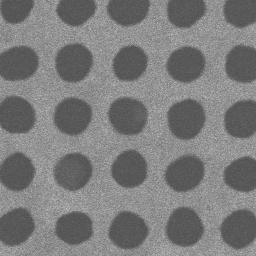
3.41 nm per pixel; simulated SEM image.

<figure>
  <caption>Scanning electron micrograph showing a regular array of holes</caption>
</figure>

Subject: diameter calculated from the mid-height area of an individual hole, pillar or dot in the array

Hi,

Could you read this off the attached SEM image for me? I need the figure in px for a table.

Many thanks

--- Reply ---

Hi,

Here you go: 37.5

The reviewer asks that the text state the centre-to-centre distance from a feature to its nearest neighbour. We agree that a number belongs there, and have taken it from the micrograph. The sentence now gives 183 nanometres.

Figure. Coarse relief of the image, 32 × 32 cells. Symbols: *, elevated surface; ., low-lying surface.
....***.....**.....**.....**....
....***.....*......**.....**....
*..*****...***....***....***....
********************************
********************************
*********.**********************
....***....****...****...****...
.....**.....**....***.....**....
.....**....***....***....***....
....***....****..****....****...
********************************
********************************
*..*****..*****..******.********
....***....***....***....****...
....***....***....***.....**....
....***....***....***....***....
*..*****..*****..*****...***....
********************************
********************************
*..*****...****...**************
....***....***....***....****...
....***.....**....***.....**....
....***....***....***....***....
*..*****..***********...*****...
********************************
********************************
*...***********.******..*****..*
....***....***....***....***....
....***.....**....***....***....
....***....***....***....***....
*..******.****....****..****...*
********************************